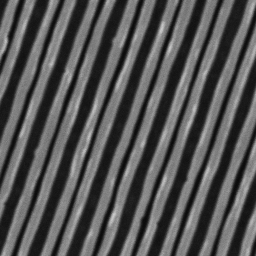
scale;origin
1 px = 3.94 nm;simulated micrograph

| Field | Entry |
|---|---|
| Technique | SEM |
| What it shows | parallel lines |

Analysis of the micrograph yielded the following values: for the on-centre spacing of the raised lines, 0.0736 microns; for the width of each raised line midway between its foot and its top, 0.0378 microns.